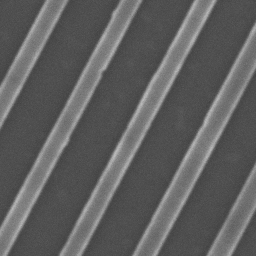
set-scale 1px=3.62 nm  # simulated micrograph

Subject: one or a few lines or trenches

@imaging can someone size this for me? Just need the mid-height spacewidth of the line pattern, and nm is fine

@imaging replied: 173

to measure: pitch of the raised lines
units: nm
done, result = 238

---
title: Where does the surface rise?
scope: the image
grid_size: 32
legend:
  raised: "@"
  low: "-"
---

------@@-------@@-------@@@-----
-----@@@------@@@-------@@------
-----@@-------@@-------@@@------
----@@@------@@@-------@@-------
----@@-------@@-------@@@------@
---@@-------@@@-------@@-------@
---@@-------@@-------@@-------@@
--@@-------@@@------@@@-------@@
-@@@-------@@-------@@-------@@@
-@@-------@@@------@@@-------@@-
@@@-------@@-------@@-------@@@-
@@-------@@@------@@@------@@@--
@@-------@@-------@@-------@@@--
@-------@@-------@@@------@@@---
@-------@@-------@@-------@@@---
-------@@-------@@@-------@@----
-------@@-------@@-------@@@----
------@@-------@@@------@@@-----
-----@@@-------@@-------@@@-----
-----@@-------@@@------@@@------
----@@@-------@@-------@@@------
----@@-------@@-------@@@-------
---@@@-------@@-------@@-------@
---@@-------@@-------@@@-------@
--@@@------@@@-------@@-------@@
--@@-------@@-------@@@------@@@
-@@@------@@@-------@@-------@@@
-@@-------@@-------@@@------@@@-
@@@------@@@------@@@-------@@@-
@@-------@@-------@@@------@@@--
@-------@@@------@@@-------@@---
@-------@@-------@@@------@@@---